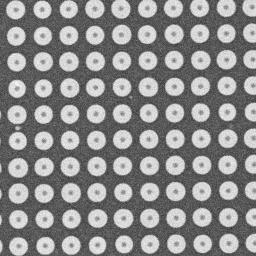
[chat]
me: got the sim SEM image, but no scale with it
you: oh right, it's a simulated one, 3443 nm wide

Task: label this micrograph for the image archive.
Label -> an array of small figures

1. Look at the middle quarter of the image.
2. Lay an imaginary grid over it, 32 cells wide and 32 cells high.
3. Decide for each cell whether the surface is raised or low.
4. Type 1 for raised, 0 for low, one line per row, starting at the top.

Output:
11100011110001110001111000111000
11100001100000000000000000000000
00000000000000000000000000000000
00000000000000000000110000000000
11100011110001110001111000111100
11110011110011111001111001111100
11110011110011111001111001111100
11100011100001110001111000111000
00000000000000000000000000000000
00000000000000000000000000000000
01000001100001110000110000111000
11100011110001111001111000111100
11110011110011111001111000111100
11100011110001111001111000111100
11100001100000110000000000000000
00000000000000000000000000000000
00000000000000000000000000000000
11100001110001111001111000111100
11110011110011111001111000111100
11110011110011111001111000111100
11100011110001110000111000111000
00000000000000000000000000000000
00000000000000000000000000000000
01000001100000110000110000111000
11110011110001111001111000111100
11110011110011111001111100111100
11110011110001111001111000111100
11100001110000110000010000011000
00000000000000000000000000000000
00000000000000000000000000000000
11100001110001110000111000111100
11110011110001111001111100111100